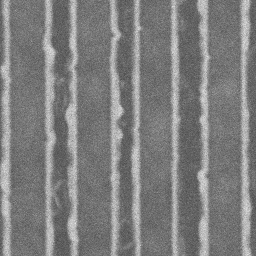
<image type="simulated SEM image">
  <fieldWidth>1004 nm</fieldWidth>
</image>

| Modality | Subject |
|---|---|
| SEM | one or a few lines or trenches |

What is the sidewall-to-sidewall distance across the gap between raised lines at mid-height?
148 nm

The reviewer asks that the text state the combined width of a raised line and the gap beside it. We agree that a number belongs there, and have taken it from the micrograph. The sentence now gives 0.252 um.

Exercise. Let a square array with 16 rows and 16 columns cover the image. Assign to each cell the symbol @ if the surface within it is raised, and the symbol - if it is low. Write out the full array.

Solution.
---@@--@@--@@--@
---@@--@@--@@--@
---@@--@@--@@--@
---@@--@@--@@--@
---@@--@@--@@--@
---@@--@@--@@--@
---@@--@@--@@--@
---@@--@@--@@--@
---@@--@@--@@--@
---@@--@@--@@--@
---@@--@@--@@--@
---@@--@@--@@--@
---@@--@@--@@--@
---@@--@@--@@--@
@--@@--@@--@@--@
@--@@--@@--@@--@